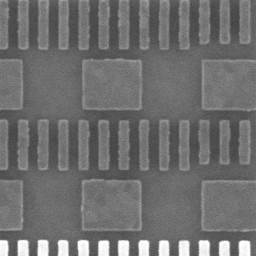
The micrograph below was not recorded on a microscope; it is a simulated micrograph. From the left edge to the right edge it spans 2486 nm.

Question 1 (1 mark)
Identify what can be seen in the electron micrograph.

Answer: wiring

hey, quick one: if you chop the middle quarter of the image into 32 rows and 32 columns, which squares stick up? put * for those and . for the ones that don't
.....**************.............
.....**************.............
.....**************.............
.....**************.............
.....**************.............
.....**************.............
.....**************.............
.....**************.............
.....**************.............
.....**************.............
.....**************.............
................................
................................
................................
*...**...**...**...**...**...**.
*...**...**...**...**...**...**.
*...**...**...**...**...**...**.
*...**...**...**...**...**...**.
*...**...**...**...**...**...**.
*...**...**...**...**...**...**.
*...**...**...**...**...**...**.
*...**...**...**...**...**...**.
*...**...**...**...**...**...**.
*...**...**...**...**...**...**.
*...**...**...**...**...**...**.
*...**...**...**...**...**...**.
................................
................................
................................
.....**************.............
.....**************.............
.....**************.............